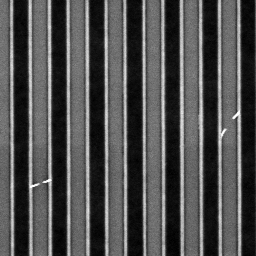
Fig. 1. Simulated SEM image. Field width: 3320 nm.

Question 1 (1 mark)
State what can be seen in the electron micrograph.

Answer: parallel lines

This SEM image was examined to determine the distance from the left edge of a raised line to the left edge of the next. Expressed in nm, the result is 491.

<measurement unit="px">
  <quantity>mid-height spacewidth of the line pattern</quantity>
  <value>17.9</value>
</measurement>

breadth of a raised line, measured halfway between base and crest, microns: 0.258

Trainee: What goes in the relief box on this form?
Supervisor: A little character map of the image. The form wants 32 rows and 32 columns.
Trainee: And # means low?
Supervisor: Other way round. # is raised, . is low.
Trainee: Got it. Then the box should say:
.###..###..##...##..###..##...##
.###..###..##...##..###..##...##
.###..###..##...##..###..##...##
.###..###..##...##..###..##...##
.###..###..##...##..###..##...##
.###..###..##...##..###..##...##
.###..###..##...##..###..##...##
.###..###..##...##..###..##...##
.###..###..##...##..###..##...##
.###..###..##...##..###..##...##
.###..###..##...##..###..##...##
.###..###..##...##..###..##...##
.###..###..##...##..###..##...##
..##..###..##...##..###..##...##
..##..###..##...##..###..##...##
..##..###..##...##..###..##...##
..##..###..##...##..###..##...##
..##..###..##...##..###..##...##
..##..###..##...##..###..##...##
..##..###..##...##..###..##...##
..##..###..##...##..###..##...##
..##..###..##...##..###..##...##
..##..###..##...##..###..##...##
..##..###..##...##..###..##...##
..##..###..##...##..###..##...##
..##..###..##...##..###..##...##
..##..###..##...##..###..##...##
..##..###..##...##..###..##...##
..##..###..##...##..###..##...##
..##..###..##...##..###..##...##
..##..###..##...##..###..##...##
..##..###..##...##..###..##...##